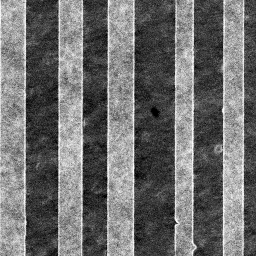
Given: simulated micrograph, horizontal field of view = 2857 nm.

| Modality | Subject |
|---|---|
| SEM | parallel lines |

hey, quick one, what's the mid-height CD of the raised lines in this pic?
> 251 nm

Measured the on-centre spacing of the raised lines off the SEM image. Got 54.3 pixels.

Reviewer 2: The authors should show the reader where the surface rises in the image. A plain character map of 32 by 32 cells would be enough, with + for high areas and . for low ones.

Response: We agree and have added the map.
+++....+++....+++.....++....++..
+++....+++....+++.....++....++..
+++....+++....+++.....++....++..
+++....+++....+++.....++....++..
+++....+++....+++.....++....++..
+++....+++....+++.....++....++..
+++....+++....+++.....++....++..
+++....+++....+++.....++....++..
+++....+++....+++.....++....++..
+++....+++....+++.....++....++..
+++....+++....+++.....++....++..
+++....+++....+++.....++....++..
+++....+++....+++.....++....++..
+++....+++....+++.....++....++..
+++....+++....+++.....++....++..
+++....+++....+++.....++....++..
+++....+++....+++.....++....++.+
+++....+++....+++.....++....++..
+++....+++....+++.....++...+++..
+++....+++....+++.....++....++..
+++....+++....+++.....++....++..
+++....+++....+++.....++....++..
+++....+++....+++.....++....++..
+++....+++....+++.....++....++..
+++....+++....+++.....++....++..
+++....+++...++++.....++....++..
+++....+++....+++.....++....++..
+++....+++....+++.....++....++..
+++....+++....+++.....++....++..
+++....+++...++++.....++....++..
+++....+++...++++.....++....++..
+++....+++....+++.....++....++..